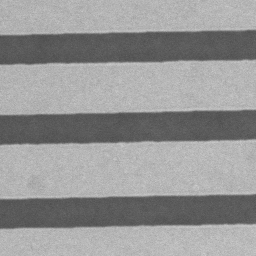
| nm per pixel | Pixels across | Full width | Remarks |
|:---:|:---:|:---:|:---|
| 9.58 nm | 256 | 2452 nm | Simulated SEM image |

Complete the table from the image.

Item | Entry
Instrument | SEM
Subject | lines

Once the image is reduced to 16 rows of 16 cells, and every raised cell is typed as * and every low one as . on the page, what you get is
****************
****************
................
................
****************
****************
****************
................
................
****************
****************
****************
................
................
****************
****************